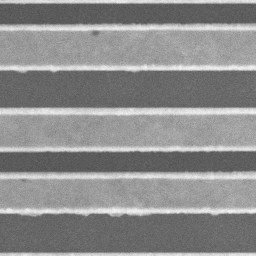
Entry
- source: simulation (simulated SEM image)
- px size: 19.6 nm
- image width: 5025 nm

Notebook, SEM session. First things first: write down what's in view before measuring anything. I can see lines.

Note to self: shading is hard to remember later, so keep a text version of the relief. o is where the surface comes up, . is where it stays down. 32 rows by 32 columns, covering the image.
................................
................................
................................
oooooooooooooooooooooooooooooooo
oooooooooooooooooooooooooooooooo
oooooooooooooooooooooooooooooooo
oooooooooooooooooooooooooooooooo
oooooooooooooooooooooooooooooooo
oooooooooooooooooooooooooooooooo
................................
................................
................................
................................
................................
oooooooooooooooooooooooooooooooo
oooooooooooooooooooooooooooooooo
oooooooooooooooooooooooooooooooo
oooooooooooooooooooooooooooooooo
oooooooooooooooooooooooooooooooo
................................
................................
................................
oooooooooooooooooooooooooooooooo
oooooooooooooooooooooooooooooooo
oooooooooooooooooooooooooooooooo
oooooooooooooooooooooooooooooooo
oooooooooooooooooooooooooooooooo
................................
................................
................................
................................
................................